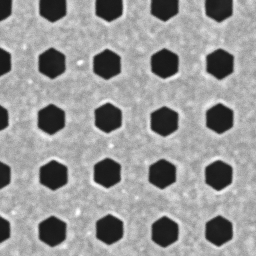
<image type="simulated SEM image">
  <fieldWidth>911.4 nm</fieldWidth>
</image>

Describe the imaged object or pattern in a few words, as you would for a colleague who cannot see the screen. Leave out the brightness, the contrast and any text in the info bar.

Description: a regular array of holes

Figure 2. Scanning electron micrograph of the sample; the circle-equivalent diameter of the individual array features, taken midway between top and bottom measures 104 nm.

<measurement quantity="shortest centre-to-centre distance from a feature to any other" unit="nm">194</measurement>